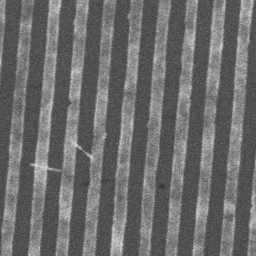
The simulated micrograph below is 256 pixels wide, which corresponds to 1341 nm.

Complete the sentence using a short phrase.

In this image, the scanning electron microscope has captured parallel lines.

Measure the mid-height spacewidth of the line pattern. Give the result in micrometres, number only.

0.0887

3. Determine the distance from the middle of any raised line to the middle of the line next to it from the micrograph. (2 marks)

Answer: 143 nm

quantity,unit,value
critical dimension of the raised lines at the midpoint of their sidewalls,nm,56.1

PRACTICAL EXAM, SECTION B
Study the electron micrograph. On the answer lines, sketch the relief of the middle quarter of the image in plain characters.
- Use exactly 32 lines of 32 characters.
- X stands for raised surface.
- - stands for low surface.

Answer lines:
--XXX----XX-----XX-----XX-----XX
--XX-----XX-----XX----XXX-----XX
--XX-----XX-----XX----XXX----XXX
--XX-----XX-----XX----XXX----XXX
--XX-----XX-----XX----XXX----XXX
--XX-----XX----XXX----XXX----XXX
--XX----XXX----XXX----XXX----XXX
--XX----XXX----XXX----XXX----XX-
--XX----XXX----XX-----XX-----XX-
--XX----XXX----XX-----XX-----XX-
-XXX----XXX----XX-----XX-----XX-
-XXX----XXX----XX-----XX----XXX-
-XXX----XX-----XX-----XX----XXX-
-XX-----XX-----XX-----XX----XXX-
-XX-----XX-----XX----XXX----XXX-
-XX-----XX-----XX----XXX----XXX-
-XX-----XX-----XX----XXX----XXX-
-XX-----XX----XXX----XXX----XXX-
-XX-----XX----XXX----XXX----XXX-
XXX----XXX----XXX----XXX----XX--
XXX----XXX----XX-----XXX----XX--
XXX----XXX----XX-----XXX----XX--
XXX----XXX----XX-----XX-----XX--
XXX----XXX----XX-----XX-----XX--
XXX----XX-----XX-----XX----XXX--
XX-----XX-----XX-----XX----XXX--
XX-----XX----XXX----XXX----XXX--
XX-----XX----XXX----XXX----XXX--
XX-----XX----XXX----XXX----XX---
XX-----XX----XXX----XXX----XX---
XX----XXX----XXX----XXX----XX---
XX----XXX----XXX----XXX----XX---